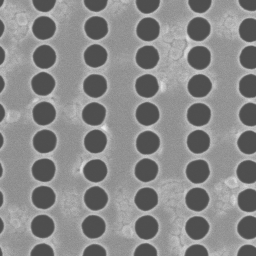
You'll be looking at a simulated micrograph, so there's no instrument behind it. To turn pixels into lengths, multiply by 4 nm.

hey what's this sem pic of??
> a regular array of holes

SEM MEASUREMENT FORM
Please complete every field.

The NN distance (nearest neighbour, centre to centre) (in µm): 0.112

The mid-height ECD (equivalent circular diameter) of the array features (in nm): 91.8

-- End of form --